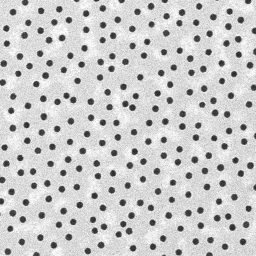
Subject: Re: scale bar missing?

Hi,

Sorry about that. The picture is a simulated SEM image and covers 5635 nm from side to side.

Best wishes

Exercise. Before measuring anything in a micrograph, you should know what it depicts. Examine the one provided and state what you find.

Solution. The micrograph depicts a regular array of holes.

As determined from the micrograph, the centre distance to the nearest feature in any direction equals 14.4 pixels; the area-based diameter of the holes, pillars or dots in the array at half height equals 6.77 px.